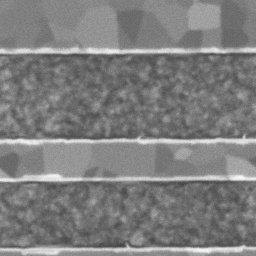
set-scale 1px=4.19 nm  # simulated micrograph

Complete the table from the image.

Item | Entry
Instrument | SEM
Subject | one or a few lines or trenches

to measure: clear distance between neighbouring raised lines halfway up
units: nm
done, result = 322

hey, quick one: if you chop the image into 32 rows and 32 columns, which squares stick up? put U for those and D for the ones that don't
UUUUUUUUUUUUUUUUUUUUUUUUUUUUUUUU
UUUUUUUUUUUUUUUUUUUUUUUUUUUUUUUU
UUUUUUUUUUUUUUUUUUUUUUUUUUUUUUUU
UUUUUUUUUUUUUUUUUUUUUUUUUUUUUUUU
UUUUUUUUUUUUUUUUUUUUUUUUUUUUUUUU
UUUUUUUUUUUUUUUUUUUUUUUUUUUUUUUU
UUUUUUUUUUUUUUUUDDDUUDUUDDUUUDDD
DDDDDDDDDDDDDDDDDDDDDDDDDDDDDDDD
DDDDDDDDDDDDDDDDDDDDDDDDDDDDDDDD
DDDDDDDDDDDDDDDDDDDDDDDDDDDDDDDD
DDDDDDDDDDDDDDDDDDDDDDDDDDDDDDDD
DDDDDDDDDDDDDDDDDDDDDDDDDDDDDDDD
DDDDDDDDDDDDDDDDDDDDDDDDDDDDDDDD
DDDDDDDDDDDDDDDDDDDDDDDDDDDDDDDD
DDDDDDDDDDDDDDDDDDDDDDDDDDDDDDDD
DDDDDDDDDDDDDDDDDDDDDDDDDDDDDDDD
DDDDDDDDDDDDDDDDDDDDDDDDDDDDDDDD
DDDDDDDDDDUDDDUUUUDUUUDDDDUUUUUD
UUUUUUUUUUUUUUUUUUUUUUUUUUUUUUUU
UUUUUUUUUUUUUUUUUUUUUUUUUUUUUUUU
UUUUUUUUUUUUUUUUUUUUUUUUUUUUUUUU
UUUUUUUUUUUUUUUUUUUUUUUUUUUUUUUU
DUDDDDDDDDDDDDDDDDDDDDDDDDDDDDDD
DDDDDDDDDDDDDDDDDDDDDDDDDDDDDDDD
DDDDDDDDDDDDDDDDDDDDDDDDDDDDDDDD
DDDDDDDDDDDDDDDDDDDDDDDDDDDDDDDD
DDDDDDDDDDDDDDDDDDDDDDDDDDDDDDDD
DDDDDDDDDDDDDDDDDDDDDDDDDDDDDDDD
DDDDDDDDDDDDDDDDDDDDDDDDDDDDDDDD
DDDDDDDDDDDDDDDDDDDDDDDDDDDDDDDD
DDDDDDDDDDDDDDDDDDDDDDDDDDDDDDDD
UUUUUUUUUUUUUUUUUUUUUUUUUUUUUUUU